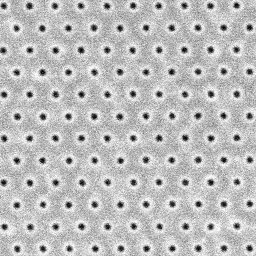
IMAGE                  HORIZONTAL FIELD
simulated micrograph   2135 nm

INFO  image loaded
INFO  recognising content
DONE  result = a regular array of holes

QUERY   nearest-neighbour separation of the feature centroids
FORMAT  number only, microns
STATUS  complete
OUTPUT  0.21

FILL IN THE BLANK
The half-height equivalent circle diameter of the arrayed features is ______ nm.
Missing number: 70.4